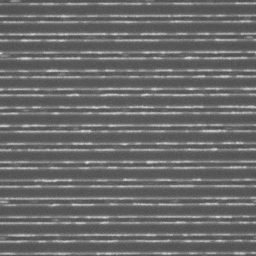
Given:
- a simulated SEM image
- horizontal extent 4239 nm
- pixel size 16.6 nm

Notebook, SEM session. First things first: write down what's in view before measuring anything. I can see parallel lines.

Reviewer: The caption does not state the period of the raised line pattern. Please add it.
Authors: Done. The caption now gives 303 nanometers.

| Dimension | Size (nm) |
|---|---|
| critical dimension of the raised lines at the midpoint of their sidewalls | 220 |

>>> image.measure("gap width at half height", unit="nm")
78.7